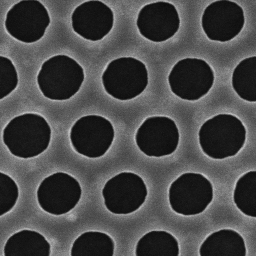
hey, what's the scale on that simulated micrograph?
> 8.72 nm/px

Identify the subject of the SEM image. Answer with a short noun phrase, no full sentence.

a regular array of holes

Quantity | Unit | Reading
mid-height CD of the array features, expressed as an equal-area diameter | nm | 380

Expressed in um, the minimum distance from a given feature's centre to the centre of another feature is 0.568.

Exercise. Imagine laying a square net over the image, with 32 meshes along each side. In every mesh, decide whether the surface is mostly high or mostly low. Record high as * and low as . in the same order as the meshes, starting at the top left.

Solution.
**...*****...******..*****....**
*.....***.....***.....****....**
*.....***.....***.....***......*
*.....***.....***.....***.....**
**...*****...*****....****...***
********************************
********************************
.*****...*****...******..*****..
..***.....***.....****....***...
..***......**.....***......**...
..***.....***.....***......**...
.****.....***.....****....***...
*******.*******.***************.
********************************
**...******.*******.*******..***
*.....***.....****....***.....**
......***.....***.....***......*
......***.....***.....***......*
*.....***.....***.....***.....**
**..*******.******...*****...***
********************************
*******************************.
..***.....****....****....****..
..***.....***.....***......**...
..***.....***.....***......**...
..***.....***.....***.....***...
.*****...*****...*****...*****..
********************************
********************************
*....*****....****....****....**
*.....***.....***.....***......*
......***.....***.....***......*